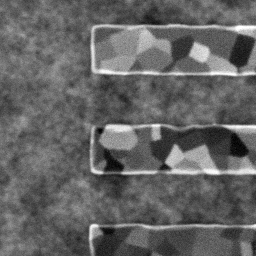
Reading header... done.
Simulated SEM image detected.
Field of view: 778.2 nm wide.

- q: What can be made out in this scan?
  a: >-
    wiring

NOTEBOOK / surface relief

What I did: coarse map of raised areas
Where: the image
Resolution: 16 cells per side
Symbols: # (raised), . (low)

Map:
................
................
......##########
......##########
......##########
................
................
................
......##########
......##########
......##########
................
................
................
......##########
......##########